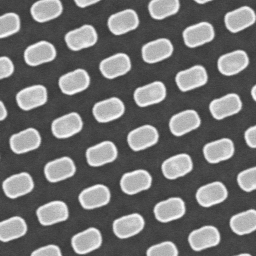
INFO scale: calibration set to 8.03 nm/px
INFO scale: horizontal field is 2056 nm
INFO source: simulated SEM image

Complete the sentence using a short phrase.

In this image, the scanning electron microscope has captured a regular array of raised bodies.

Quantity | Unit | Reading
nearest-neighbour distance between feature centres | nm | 354